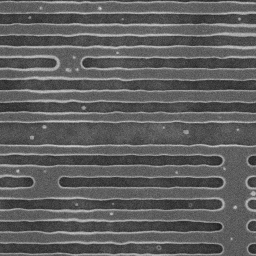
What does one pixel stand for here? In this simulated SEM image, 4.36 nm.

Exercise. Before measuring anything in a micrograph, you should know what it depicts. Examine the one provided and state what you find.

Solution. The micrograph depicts groups of lines, slits or small figures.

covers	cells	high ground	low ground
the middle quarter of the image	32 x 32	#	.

#####...........................
################################
################################
################################
................................
................................
................................
################################
################################
....###.......###############...
................................
................................
################################
################################
...........###....##..####....##
................................
................................
................................
................................
................................
.......##########.##############
################################
################################
................................
................................
##########.############.########
################################
################################
................................
................................
................................
################################